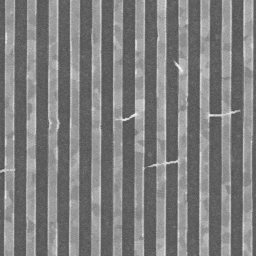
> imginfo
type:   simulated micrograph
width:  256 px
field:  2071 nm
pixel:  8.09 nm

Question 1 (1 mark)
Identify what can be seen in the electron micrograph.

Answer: parallel lines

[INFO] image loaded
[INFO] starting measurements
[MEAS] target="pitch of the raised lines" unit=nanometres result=175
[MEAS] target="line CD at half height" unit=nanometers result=72.8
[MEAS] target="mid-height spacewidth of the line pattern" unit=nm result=105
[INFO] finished